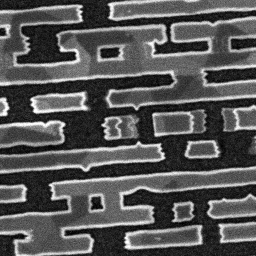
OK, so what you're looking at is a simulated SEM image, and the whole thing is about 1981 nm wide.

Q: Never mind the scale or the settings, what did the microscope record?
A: parallel lines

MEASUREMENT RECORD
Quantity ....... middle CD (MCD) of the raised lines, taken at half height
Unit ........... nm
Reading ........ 130